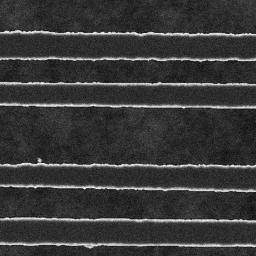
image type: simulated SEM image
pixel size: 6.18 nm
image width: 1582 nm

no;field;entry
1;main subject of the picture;lines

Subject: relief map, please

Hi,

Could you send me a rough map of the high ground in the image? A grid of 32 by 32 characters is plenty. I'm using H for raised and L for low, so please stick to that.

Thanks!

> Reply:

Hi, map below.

LLLLLLLLLLLLLLLLLLLLLLLLLLLLLLLL
LLLLLLLLLLLLLLLLLLLLLLLLLLLLLLLL
LLLLLLLLLLLLLLLLLLLLLLLLLLLLLLLL
LLLLLLLLLLLLLLLLLLLLLLLLLLLLLLLL
HHHHHHHHHHHHHHHHHHHHHHHHHHHHHHHH
HHHHHHHHHHHHHHHHHHHHHHHHHHHHHHHH
HHHHHHHHHHHHHHHHHHHHHHHHHHHHHHHH
LLLLLLLLLLLLLLLLLLLLHLLLHHHHHLHH
LLLLLLLLLLLLLLLLLLLLLLLLLLLLLLLL
LLLLLLLLLLLLLLLLLLLLLLLLLLLLLLLL
HHHHHHHHHHHHHHHHHHHHHHHHHHHLHHHL
HHHHHHHHHHHHHHHHHHHHHHHHHHHHHHHH
HHHHHHHHHHHHHHHHHHHHHHHHHHHHHHHH
LLLLLLLLLLLLLLLLLLLLLLLLLLLLLLLL
LLLLLLLLLLLLLLLLLLLLLLLLLLLLLLLL
LLLLLLLLLLLLLLLLLLLLLLLLLLLLLLLL
LLLLLLLLLLLLLLLLLLLLLLLLLLLLLLLL
LLLLLLLLLLLLLLLLLLLLLLLLLLLLLLLL
LLLLLLLLLLLLLLLLLLLLLLLLLLLLLLLL
LLLLLLLLLLLLLLLLLLLLLLLLLLLLLLLL
LLLHLHLLLLLLLLLLLLLLLLLLLLLLLLLL
HHHHHHHHHHHHHHHHHHHHHHHHHHHHHHHH
HHHHHHHHHHHHHHHHHHHHHHHHHHHHHHHH
LLLLLLLLLLHLHHHHHHHHHHHHHHHHHHHH
LLLLLLLLLLLLLLLLLLLLLLLLLLLLLLLL
LLLLLLLLLLLLLLLLLLLLLLLLLLLLLLLL
LLLLLLLLLLLLLLLLLLLLLLLLLLLLLLLL
HHHHHHHHHHHLHHHHHLLLLLLLLLLLLLLL
HHHHHHHHHHHHHHHHHHHHHHHHHHHHHHHH
HHHHHHHHHHHHHHHHHHHHHHHHHHHHHHHH
HHHHHHHHHHHHHHHHHHHHHHHHHHHHHHHH
LLLLLLLLLLLLLLLLLLLLLLLLLLLLLLLL